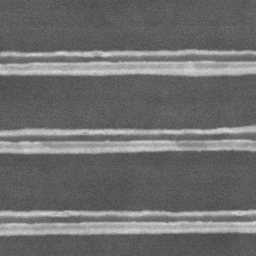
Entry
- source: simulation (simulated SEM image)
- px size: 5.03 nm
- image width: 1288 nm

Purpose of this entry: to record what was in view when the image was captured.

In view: lines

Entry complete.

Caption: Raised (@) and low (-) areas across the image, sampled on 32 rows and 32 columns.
--------------------------------
--------------------------------
--------------------------------
--------------------------------
--------------------------------
--------------------------------
-----------@@-------------------
@@@@@@@@@@@@@@@@@@@@@@@@@@@@@@@@
@@@@@@@@@@@@@@@@@@@@@@@@@@@@@@@@
--------------------------------
--------------------------------
--------------------------------
--------------------------------
--------------------------------
--------------------------------
--------------------------------
---------@@@@@@@----@@--@@@@@@@@
@@@@@@@@@@@@@@@@@@@@@@@@@@@@@@@@
@@@@@@@@@@@@@@@@@@@@@@@@@@@@@@@@
--------------------------------
--------------------------------
--------------------------------
--------------------------------
--------------------------------
--------------------------------
--------------------------------
--------@--------------------@--
@@@@@@@@@@@@@@@@@@@@@@@@@@@@@@@@
@@@@@@@@@@@@@@@@@@@@@@@@@@@@@@@@
--------------------------------
--------------------------------
--------------------------------